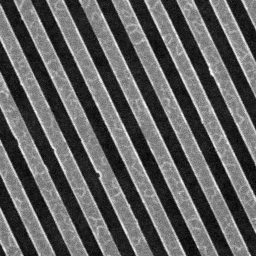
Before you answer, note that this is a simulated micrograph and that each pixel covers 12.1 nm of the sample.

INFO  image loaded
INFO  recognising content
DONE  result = parallel lines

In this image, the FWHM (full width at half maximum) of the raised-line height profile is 177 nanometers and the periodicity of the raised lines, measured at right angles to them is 355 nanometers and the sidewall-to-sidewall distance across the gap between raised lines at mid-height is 177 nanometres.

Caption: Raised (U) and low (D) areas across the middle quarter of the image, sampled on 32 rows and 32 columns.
DDDDUUUUDDDDUUUUDDDDUUUUDDDDUUUU
DDDDUUUUDDDDUUUUDDDDUUUUDDDDUUUU
DDDDDUUUUDDDDUUUUDDDDUUUUDDDDUUU
UDDDDUUUUDDDDUUUUDDDDUUUUDDDDUUU
UDDDDDUUUDDDDDUUUUDDDDUUUUDDDDUU
UUDDDDUUUUDDDDUUUUDDDDUUUUDDDDUU
UUDDDDUUUUDDDDDUUUUDDDDUUUUDDDDU
UUUDDDDUUUUDDDDUUUUDDDDUUUUDDDDD
UUUDDDDUUUUDDDDDUUUUDDDDUUUUDDDD
UUUUDDDDUUUUDDDDUUUUDDDDUUUUDDDD
UUUUDDDDUUUUDDDDDUUUDDDDDUUUUDDD
DUUUUDDDDUUUUDDDDUUUUDDDDUUUUDDD
DUUUUDDDDUUUUDDDDUUUUDDDDDUUUUDD
DDUUUUDDDDUUUUDDDDUUUUDDDDUUUUDD
DDUUUUDDDDUUUUDDDDUUUUDDDDDUUUUD
DDDUUUUDDDDUUUUDDDDUUUUDDDDUUUUD
DDDUUUUDDDDUUUUDDDDUUUUDDDDDUUUD
DDDDUUUUDDDDUUUUDDDDUUUUDDDDUUUU
DDDDUUUUDDDDUUUUDDDDUUUUDDDDUUUU
DDDDDUUUUDDDDUUUUDDDDUUUUDDDDUUU
UDDDDUUUUDDDDUUUUDDDDUUUUDDDDUUU
UDDDDDUUUUDDDDUUUUDDDDUUUUDDDDUU
UUDDDDUUUUDDDDUUUUDDDDUUUUDDDDUU
UUDDDDDUUUDDDDDUUUUDDDDUUUUDDDDU
UUUDDDDUUUUDDDDUUUUDDDDUUUUDDDDU
UUUDDDDUUUUDDDDDUUUUDDDDUUUUDDDD
UUUUDDDDUUUUDDDDUUUUDDDDUUUUDDDD
UUUUDDDDDUUUDDDDDUUUUDDDDUUUUDDD
DUUUUDDDDUUUUDDDDUUUUDDDDUUUUDDD
DUUUUDDDDUUUUDDDDDUUUDDDDDUUUUDD
DDUUUUDDDDUUUUDDDDUUUUDDDDUUUUDD
DDUUUUDDDDUUUUDDDDUUUUDDDDDUUUUD